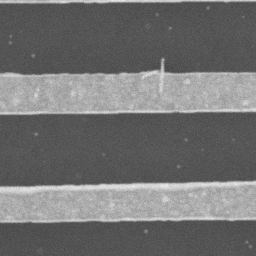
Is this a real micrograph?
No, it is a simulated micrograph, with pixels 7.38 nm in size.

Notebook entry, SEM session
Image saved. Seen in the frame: lines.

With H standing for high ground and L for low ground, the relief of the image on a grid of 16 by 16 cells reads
LLLLLLLLLLLLLLLL
LLLLLLLLLLLLLLLL
LLLLLLLLLLLLLLLL
LLLLLLLLLLLLLLLL
LLLLLLLLLLLLLLLL
HHHHHHHHHHHHHHHH
HHHHHHHHHHHHHHHH
LLLLLLLLLLLLLLLL
LLLLLLLLLLLLLLLL
LLLLLLLLLLLLLLLL
LLLLLLLLLLLLLLLL
LLLLLLLLLLLHHHHH
HHHHHHHHHHHHHHHH
HHHHHHHHHHHHHHHH
LLLLLLLLLLLLLLLL
LLLLLLLLLLLLLLLL